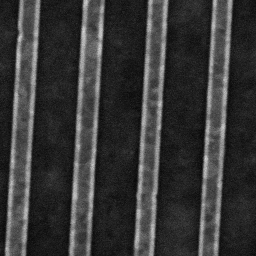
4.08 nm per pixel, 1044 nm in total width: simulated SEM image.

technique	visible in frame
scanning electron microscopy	one or a few lines or trenches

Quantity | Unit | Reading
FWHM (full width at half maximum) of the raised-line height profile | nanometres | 66.1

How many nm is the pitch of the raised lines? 262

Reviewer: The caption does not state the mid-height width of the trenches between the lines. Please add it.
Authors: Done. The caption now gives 195 nanometers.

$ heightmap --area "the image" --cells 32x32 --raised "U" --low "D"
DDDUUDDDDDDUUDDDDDDUUDDDDDDUUDDD
DDDUUDDDDDDUUDDDDDDUUDDDDDDUUDDD
DDDUUDDDDDDUUDDDDDDUUDDDDDDUUDDD
DDUUUDDDDDUUUDDDDDDUUDDDDDDUUDDD
DDDUDDDDDDUUUDDDDDDUDDDDDDDUUDDD
DDUUDDDDDDUUUDDDDDUUDDDDDDDUDDDD
DDUUDDDDDDUUDDDDDDUUDDDDDDUUDDDD
DDUUDDDDDDUUDDDDDDUUDDDDDDUUDDDD
DDUUDDDDDDUUDDDDDDUUDDDDDDUUDDDD
DDUUDDDDDDUUDDDDDDUUDDDDDDUUDDDD
DDUUDDDDDDUUDDDDDDUUDDDDDDUUDDDD
DDUUDDDDDDUUDDDDDDUUDDDDDDUUDDDD
DDUUDDDDDDUUDDDDDDUUDDDDDDUUDDDD
DDUUDDDDDDUUDDDDDDUUDDDDDDUUDDDD
DDUUDDDDDDUUDDDDDDUUDDDDDDUUDDDD
DDUUDDDDDDUUDDDDDDUUDDDDDDUUDDDD
DDUUDDDDDDUUDDDDDDUUDDDDDDUUDDDD
DDUUDDDDDDUUDDDDDDUUDDDDDDUUDDDD
DDUUDDDDDDUUDDDDDDUUDDDDDDUUDDDD
DDUUDDDDDDUUDDDDDDUUDDDDDDUUDDDD
DDUUDDDDDDUUDDDDDDUUDDDDDDUUDDDD
DUUDDDDDDUUUDDDDDDUUDDDDDDUUDDDD
DUUDDDDDDUUUDDDDDDUDDDDDDDUDDDDD
DUUDDDDDDUUUDDDDDUUDDDDDDDUDDDDD
DUUDDDDDDUUDDDDDDUUDDDDDDUUDDDDD
DUUDDDDDDUUDDDDDDUUDDDDDDUUDDDDD
DUUDDDDDDUUDDDDDDUUDDDDDDUUDDDDD
DUUDDDDDDUUDDDDDDUUDDDDDDUUDDDDD
DUUDDDDDDUUDDDDDDUUDDDDDDUUDDDDD
DUUDDDDDDUUDDDDDDUUDDDDDDUUDDDDD
DUUDDDDDDUUDDDDDDUUDDDDDDUUDDDDD
DUUDDDDDDUUDDDDDDUUDDDDDDUUDDDDD